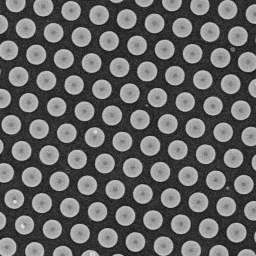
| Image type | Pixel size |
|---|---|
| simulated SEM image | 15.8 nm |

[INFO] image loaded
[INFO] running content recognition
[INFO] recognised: an array of small figures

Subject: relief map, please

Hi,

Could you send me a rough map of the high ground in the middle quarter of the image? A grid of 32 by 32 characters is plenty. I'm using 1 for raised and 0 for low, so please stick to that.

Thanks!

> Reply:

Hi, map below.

11000111100011110001111000000000
00000111100011110011111000111100
00000000000011110011111001111100
01110000000000000001111001111100
11111000111000000000000000111100
11111001111100011100000000000000
01111001111100111110001110000000
00100001111100111110011110000111
00000000110000111110011111001111
00001000000000011100011110001111
00011110000110000000001100001111
00011110001111000000000000000111
00011110001111000111100000000000
00011110001111000111100011110000
00000000001111000111100011110001
11000000000000000111100011110001
11100011100000000000000011110011
11100111110001110000000000000001
11100111110011111000111000000000
11000011110011111001111100011100
00000001100011111001111100111110
00000000000001110001111100111110
01111000001000000000111000111110
01111100111100000000000000011100
01111100111110011110000000000000
00111000111110011111001111000000
00000000111100011110001111000111
00000000000000011110001111000111
10001110000000000000001111000111
10001111000111000000000000000111
10011111000111100011100000000000
00001111001111100011110001110000